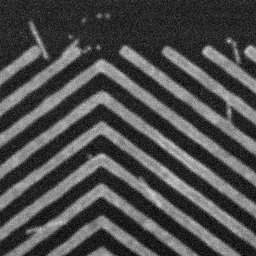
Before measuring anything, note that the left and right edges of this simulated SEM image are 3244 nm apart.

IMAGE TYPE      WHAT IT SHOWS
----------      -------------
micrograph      groups of lines, slits or small figures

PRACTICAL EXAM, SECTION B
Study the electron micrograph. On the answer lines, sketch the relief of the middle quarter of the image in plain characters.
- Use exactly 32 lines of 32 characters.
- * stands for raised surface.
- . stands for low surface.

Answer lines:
.......*****.......***.......***
......*******.......***........*
....****...****......****.......
...****.....****.......***......
..***.........***.......***.....
****...........***.......****...
***.............****......****..
*.......***......****.......***.
.......*****.......***.......***
.....********.......****.......*
....****...****......****.......
...****.....****.......***......
..***.........***.......****....
****...........****......****...
**..............****.......***..
*.......***......****.......****
.......*****.......****......***
.....****.****......****.......*
....***....****.......***.......
...***......****.......***......
.****.........****.......***....
***............****.......***...
**...............***.......***..
*.......***.......****.......***
......******.......****.......**
.....****.****.......***.......*
....***....****.......****......
..****.......***.......****.....
.****.........****.......***....
***.............***.......***...
**.......*.......****......****.
*......****........***......****